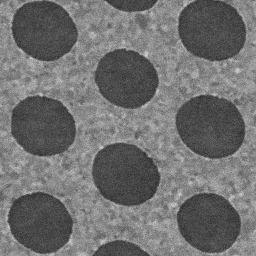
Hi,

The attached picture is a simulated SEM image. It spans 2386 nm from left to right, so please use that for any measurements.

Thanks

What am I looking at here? holes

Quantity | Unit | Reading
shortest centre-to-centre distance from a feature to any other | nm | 896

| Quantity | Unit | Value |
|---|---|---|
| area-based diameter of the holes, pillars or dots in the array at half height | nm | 594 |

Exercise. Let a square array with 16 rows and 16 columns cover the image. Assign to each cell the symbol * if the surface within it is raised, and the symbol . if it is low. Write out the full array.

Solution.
*...***..***...*
*....******....*
*....******....*
**..**...***...*
******....******
******....******
*...***..**....*
*....******....*
*....******....*
**..**...***...*
******....******
******....******
*...***..***..**
*...*******....*
*...*******....*
**..**...***..**